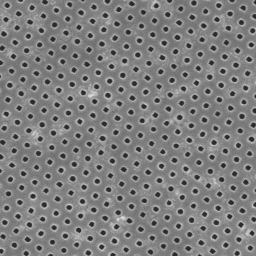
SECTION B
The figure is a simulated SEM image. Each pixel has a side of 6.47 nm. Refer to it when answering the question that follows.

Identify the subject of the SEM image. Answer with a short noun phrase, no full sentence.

a regular array of holes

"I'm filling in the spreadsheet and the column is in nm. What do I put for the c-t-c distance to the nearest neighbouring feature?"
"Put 90.1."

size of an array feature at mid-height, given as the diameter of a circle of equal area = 34.3 nm